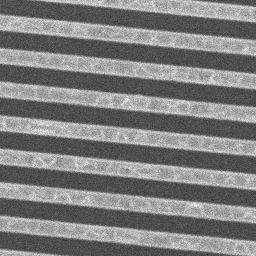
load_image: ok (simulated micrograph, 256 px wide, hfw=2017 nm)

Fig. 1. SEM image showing parallel lines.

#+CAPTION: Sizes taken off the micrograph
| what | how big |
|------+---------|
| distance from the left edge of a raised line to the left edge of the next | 263 nm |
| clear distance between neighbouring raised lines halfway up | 0.156 um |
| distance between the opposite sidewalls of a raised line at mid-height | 107 nanometers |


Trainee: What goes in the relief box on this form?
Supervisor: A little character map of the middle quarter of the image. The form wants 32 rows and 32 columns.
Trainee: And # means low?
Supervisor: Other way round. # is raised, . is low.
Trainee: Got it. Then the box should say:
#########################.......
...#############################
.............###################
.......................#########
................................
................................
#...............................
###########.....................
#####################...........
################################
.........#######################
...................#############
.............................###
................................
................................
#######.........................
#################...............
###########################.....
.....###########################
...............#################
.........................#######
................................
................................
####............................
#############...................
#######################.........
.###############################
...........#####################
.....................###########
...............................#
................................
................................